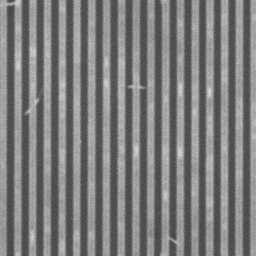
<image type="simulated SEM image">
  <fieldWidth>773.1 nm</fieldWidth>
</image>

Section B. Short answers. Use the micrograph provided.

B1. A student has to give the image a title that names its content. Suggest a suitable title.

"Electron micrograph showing parallel lines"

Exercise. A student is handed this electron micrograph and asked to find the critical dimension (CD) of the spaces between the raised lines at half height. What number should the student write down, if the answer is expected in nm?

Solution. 26.1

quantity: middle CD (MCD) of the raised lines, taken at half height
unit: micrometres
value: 0.0181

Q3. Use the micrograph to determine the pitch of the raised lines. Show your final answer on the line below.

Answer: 14.8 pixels